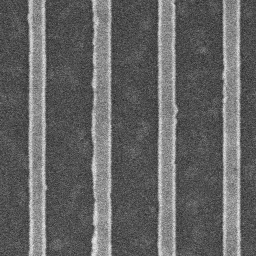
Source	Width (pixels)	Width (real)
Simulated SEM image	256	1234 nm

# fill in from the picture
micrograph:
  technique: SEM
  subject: one or a few lines or trenches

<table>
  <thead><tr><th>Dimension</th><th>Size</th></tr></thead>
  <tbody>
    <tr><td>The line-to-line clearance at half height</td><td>242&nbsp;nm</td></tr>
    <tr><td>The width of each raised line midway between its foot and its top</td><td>68.1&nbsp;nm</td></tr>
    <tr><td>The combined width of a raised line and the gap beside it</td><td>64.9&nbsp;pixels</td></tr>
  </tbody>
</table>